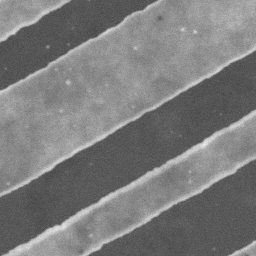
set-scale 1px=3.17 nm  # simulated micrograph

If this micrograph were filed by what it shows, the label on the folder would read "lines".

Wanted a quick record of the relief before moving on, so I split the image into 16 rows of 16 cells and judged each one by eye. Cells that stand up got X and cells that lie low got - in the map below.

XXXX-----XXXXXXX
XX-----XXXXXXXXX
------XXXXXXXXXX
----XXXXXXXXXXX-
--XXXXXXXXXXXX--
XXXXXXXXXXXX----
XXXXXXXXXX------
XXXXXXXX-------X
XXXXXXX------XXX
XXXXX-------XXXX
XXX-------XXXXX-
XX------XXXXX---
------XXXXXX----
-----XXXXX------
---XXXXX--------
-XXXXX---------X